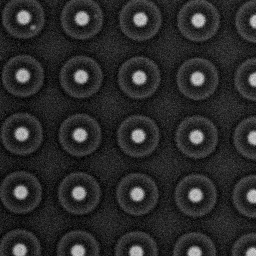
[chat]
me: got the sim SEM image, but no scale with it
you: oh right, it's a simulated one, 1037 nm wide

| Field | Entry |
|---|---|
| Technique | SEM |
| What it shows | an array of small figures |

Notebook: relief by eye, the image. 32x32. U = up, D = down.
DUUUUDDDUUUUDDDDUUUDDDDUUUDDDDDU
UUUUUDDDUUUUUDDUUUUUDDUUUUUDDDUU
UUUUUUDDUUUUUDDUUUUUDDUUUUUDDUUU
DUUUUDDDUUUUUDDUUUUUDDUUUUUDDDUU
DDUUDDDDDUUUDDDDUUUDDDDUUUUDDDUU
DDDDDDDDDDDDDDDDDDDDDDDDDDDDDDDD
DDDDDDDDDDDDDDDDDDDDDDDDDDDDDDDD
DUUUUDDDDUUUDDDDUUUDDDDDUUDDDDDU
DUUUUDDDUUUUUDDUUUUUDDUUUUUDDDUU
UUUUUDDDUUUUUDDUUUUUDDUUUUUDDUUU
UUUUUDDDUUUUUDDUUUUUDDUUUUUDDUUU
DUUUDDDDUUUUDDDDUUUDDDDUUUUDDDUU
DDDDDDDDDDDDDDDDDDDDDDDDDDDDDDDU
DDDDDDDDDDDDDDDDDDDDDDDDDDDDDDDD
DUUUDDDDDUUDDDDDDUDDDDDDDDDDDDDD
UUUUUDDDUUUUDDDUUUUDDDDUUUUDDDUU
UUUUUDDUUUUUUDDUUUUUDDUUUUUDDUUU
UUUUUDDUUUUUUDDUUUUUDDUUUUUDDUUU
DUUUUDDDUUUUDDDUUUUDDDUUUUUDDDUU
DDDDDDDDDDDDDDDDUUDDDDDUUUDDDDDU
DDDDDDDDDDDDDDDDDDDDDDDDDDDDDDDD
DDDDDDDDDDDDDDDDDDDDDDDDDDDDDDDD
DUUUUDDDUUUUDDDUUUUDDDDUUUDDDDUU
UUUUUDDUUUUUDDDUUUUUDDUUUUUDDUUU
UUUUUDDUUUUUDDDUUUUUDDUUUUUDDUUU
UUUUUDDDUUUUDDDUUUUDDDUUUUUDDUUU
DDUDDDDDDUUDDDDDUUDDDDDUUUDDDDUU
DDDDDDDDDDDDDDDDDDDDDDDDDDDDDDDD
DDDDDDDDDDDDDDDDDDDDDDDDDDDDDDDD
DUUUDDDDUUUDDDDUUUUDDDDUUUDDDDUU
UUUUUDDUUUUUDDDUUUUDDDUUUUUDDUUU
UUUUUDDUUUUUDDUUUUUUDDUUUUUDDUUU